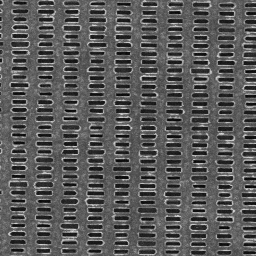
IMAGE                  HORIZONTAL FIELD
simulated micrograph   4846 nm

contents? a regular array of holes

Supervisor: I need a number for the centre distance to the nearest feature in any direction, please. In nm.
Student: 152